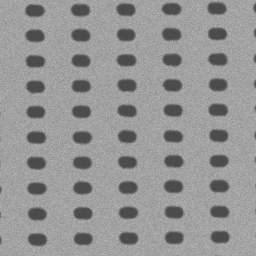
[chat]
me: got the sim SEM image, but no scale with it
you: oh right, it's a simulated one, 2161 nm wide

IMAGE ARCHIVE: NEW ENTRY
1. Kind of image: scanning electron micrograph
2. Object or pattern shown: a regular array of holes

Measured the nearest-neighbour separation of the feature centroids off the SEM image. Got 212 nanometers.